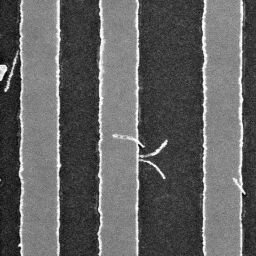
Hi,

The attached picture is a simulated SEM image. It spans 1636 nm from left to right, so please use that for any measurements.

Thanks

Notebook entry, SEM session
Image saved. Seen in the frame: lines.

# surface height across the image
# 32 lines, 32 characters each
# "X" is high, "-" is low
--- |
---XXXX-----XXXXX---------XXXX--
---XXXX------XXXX--------XXXXX--
---XXXX------XXXX--------XXXXX--
---XXXX------XXXX--------XXXXX--
---XXXX------XXXX--------XXXXX--
---XXXX------XXXX--------XXXXX--
---XXXX------XXXX--------XXXXX--
---XXXX-----XXXXX---------XXXX--
X--XXXX-----XXXXX--------XXXXX--
---XXXX-----XXXXX--------XXXXX--
---XXXX-----XXXXX--------XXXXX--
---XXXX-----XXXXX--------XXXXX--
---XXXX-----XXXXX---------XXXX--
---XXXX-----XXXXX--------XXXXX--
---XXXX-----XXXXX--------XXXXX--
---XXXX-----XXXXX--------XXXXX--
---XXXX-----XXXXX--------XXXXX--
---XXXX-----XXXXX---------XXXX--
---XXXX-----XXXXX--------XXXXX--
---XXXX-----XXXXX--------XXXXX--
---XXXX------XXXX--------XXXXX--
--XXXXX-----XXXXX--------XXXXX--
---XXXX-----XXXXX--------XXXXX--
---XXXX-----XXXXX---------XXXX--
---XXXX-----XXXXX--------XXXXX--
---XXXX-----XXXXX--------XXXXX--
---XXXX-----XXXXX--------XXXXX--
---XXXX------XXXX--------XXXXX--
---XXXX-----XXXXX--------XXXXX--
---XXXX-----XXXXX--------XXXXX--
---XXXX-----XXXXX--------XXXXX--
---XXXX-----XXXXX--------XXXXX--